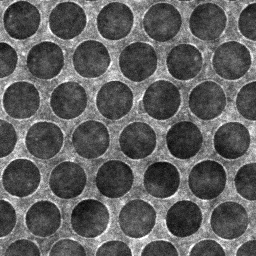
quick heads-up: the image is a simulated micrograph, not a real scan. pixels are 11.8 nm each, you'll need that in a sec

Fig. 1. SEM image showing a regular array of holes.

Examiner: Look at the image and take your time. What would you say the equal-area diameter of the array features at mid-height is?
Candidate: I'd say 458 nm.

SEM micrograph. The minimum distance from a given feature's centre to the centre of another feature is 534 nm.